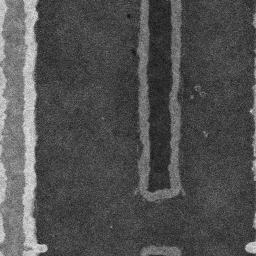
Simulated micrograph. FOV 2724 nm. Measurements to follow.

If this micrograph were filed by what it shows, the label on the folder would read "one or a few lines or trenches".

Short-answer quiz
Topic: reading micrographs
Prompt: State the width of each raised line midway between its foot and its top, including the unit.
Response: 331 nm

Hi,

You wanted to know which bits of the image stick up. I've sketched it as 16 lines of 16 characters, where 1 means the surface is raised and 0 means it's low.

1100000001100000
1100000001100000
1100000001100000
1100000001100000
1100000001100000
1100000001100000
1100000001100000
1100000001100000
1100000001100000
1100000001100000
1100000001100000
1100000001100000
1100000000000000
1100000000000000
1100000000000000
1100000000000000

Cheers